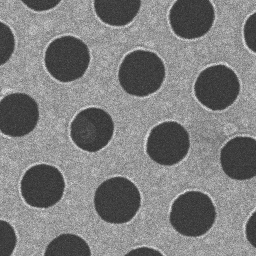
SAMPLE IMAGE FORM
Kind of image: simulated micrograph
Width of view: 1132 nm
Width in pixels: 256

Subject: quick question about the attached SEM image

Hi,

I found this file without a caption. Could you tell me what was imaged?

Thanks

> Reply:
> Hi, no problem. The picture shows a regular array of holes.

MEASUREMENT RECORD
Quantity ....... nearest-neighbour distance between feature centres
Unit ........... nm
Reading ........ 332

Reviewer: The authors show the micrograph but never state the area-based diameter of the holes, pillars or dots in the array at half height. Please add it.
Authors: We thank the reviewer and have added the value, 45 pixels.